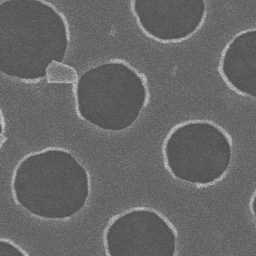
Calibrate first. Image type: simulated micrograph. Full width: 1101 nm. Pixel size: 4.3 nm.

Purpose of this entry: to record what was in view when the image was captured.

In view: holes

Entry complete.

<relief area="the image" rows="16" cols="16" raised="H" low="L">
LLLHHHHHLLLLLHHH
LLLLHHHHHLLLHHHH
LLLLHHHHHHHHHHHL
LLLLHHHHHHHHHHLL
LLLHHLLLHHHHHHLL
HHHHHLLLLHHHHHHL
HHHHHLLLLHHHHHHH
HHHHHLLLHHHHHHHH
HHHHHHHHHHHLLLHH
HHHLHHHHHHLLLLHH
HLLLLHHHHHHLLLHH
HLLLLHHHHHHHHHHH
HLLLLHHHHHHHHHHH
HHHLHHHHLLHHHHHH
HHHHHHHLLLLHHHHH
LHHHHHHLLLLHHHHH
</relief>